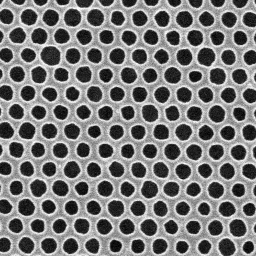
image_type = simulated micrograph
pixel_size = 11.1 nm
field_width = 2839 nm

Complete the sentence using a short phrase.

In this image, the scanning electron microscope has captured a regular array of holes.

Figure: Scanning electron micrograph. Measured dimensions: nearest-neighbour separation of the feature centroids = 239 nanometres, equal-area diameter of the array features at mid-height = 171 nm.